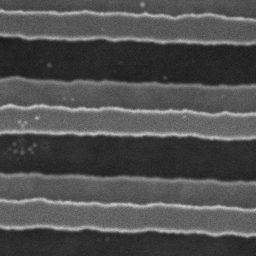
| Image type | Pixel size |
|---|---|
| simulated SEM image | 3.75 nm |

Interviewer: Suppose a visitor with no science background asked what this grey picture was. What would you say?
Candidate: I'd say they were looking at lines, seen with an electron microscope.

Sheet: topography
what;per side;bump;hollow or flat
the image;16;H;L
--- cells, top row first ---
HHHHHHHHHHHHHHHH
HHHHHHHHHHHHHHHH
LLLLLLLHLHHHHHHH
LLLLLLLLLLLLLLLL
LLLLLLLLLLLLLLLL
HHHHHHHHHHHHHHHH
HHHHHHHHHHHHHHHH
HHHHHHHHHHHHHHHH
LLLLLLLLLLLLHHHH
LLLLLLLLLLLLLLLL
LLLLLLLLLLLLLLLL
HHHHHHHHHHHHHHHH
HHHHHHHHHHHHHHHH
HHHHHHHHHHHHHHHH
LLLLLLLLLLLHHHHH
LLLLLLLLLLLLLLLL